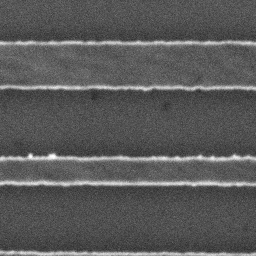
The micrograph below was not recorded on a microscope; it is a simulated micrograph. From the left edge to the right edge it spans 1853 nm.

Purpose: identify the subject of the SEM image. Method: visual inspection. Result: lines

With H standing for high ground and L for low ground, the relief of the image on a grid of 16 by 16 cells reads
LLLLLLLLLLLLLLLL
LLLLLLLLLLLLLLLL
LLLLLLLLLLLLLLLL
HHHHHHHHHHHHHHHH
HHHHHHHHHHHHHHHH
LHHHHHHHHHHHHHHH
LLLLLLLLLLLLLLLL
LLLLLLLLLLLLLLLL
LLLLLLLLLLLLLLLL
LLLLLLLLLLLLLLLL
HHHHHHHHHHHHHHHH
HHHHHHHHHHHHHHHH
LLLLLLLLLLLLLLLL
LLLLLLLLLLLLLLLL
LLLLLLLLLLLLLLLL
LLLLLLLLLLLLLLLL